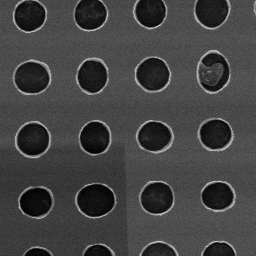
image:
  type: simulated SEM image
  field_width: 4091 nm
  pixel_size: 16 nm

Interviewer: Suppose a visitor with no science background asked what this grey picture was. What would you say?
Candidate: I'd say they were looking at a regular array of holes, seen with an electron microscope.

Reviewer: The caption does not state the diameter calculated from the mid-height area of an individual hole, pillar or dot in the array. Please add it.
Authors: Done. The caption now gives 520 nm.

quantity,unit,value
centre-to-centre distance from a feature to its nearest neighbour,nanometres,968